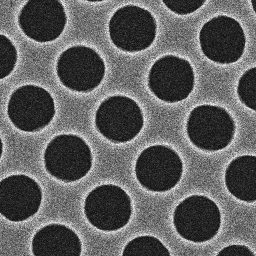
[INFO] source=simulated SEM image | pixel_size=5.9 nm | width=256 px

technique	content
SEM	a regular array of holes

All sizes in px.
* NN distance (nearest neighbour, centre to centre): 63.3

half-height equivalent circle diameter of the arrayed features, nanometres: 278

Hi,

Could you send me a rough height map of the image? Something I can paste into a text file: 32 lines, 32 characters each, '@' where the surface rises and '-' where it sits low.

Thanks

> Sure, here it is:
@@@-----@@@@@@@@@@@@@----@@@@@@-
@@@-----@@@@@@-----@@@--@@@@@@@@
@@------@@@@@@-----@@@@@@@---@@@
@@@-----@@@@@@------@@@@@-----@@
@@@----@@@@@@@-----@@@@@@------@
--@@@@@@@@@@@@-----@@@@@@------@
--@@@@@@----@@@@@@@@@@@@@-----@@
--@@@@@------@@@@@@@---@@@----@@
--@@@@@------@@@@@@-----@@@@@@@@
-@@@@@@------@@@@@@-----@@@@@@--
@@@@@@@@----@@@@@@@-----@@@@@@--
@@----@@@@@@@@@@@@@-----@@@@@@--
@------@@@@@@---@@@@---@@@@@@@--
@------@@@@@-----@@@@@@@----@@@-
@------@@@@@------@@@@@@-----@@@
@@----@@@@@@------@@@@@------@@@
@@@@@@@@@@@@-----@@@@@@------@@@
@@@@@@@---@@@@--@@@@@@@@-----@@@
@@@@@@-----@@@@@@@---@@@@---@@@@
@@@@@@-----@@@@@@-----@@@@@@@@-@
@@@@@@-----@@@@@@------@@@@@@---
@@@@@@-----@@@@@@------@@@@@----
----@@@@--@@@@@@@-----@@@@@@----
-----@@@@@@@---@@@---@@@@@@@----
-----@@@@@@-----@@@@@@@@-@@@@---
-----@@@@@@-----@@@@@@-----@@@@@
-----@@@@@@-----@@@@@@-----@@@@@
@--@@@@@@@@-----@@@@@@------@@@@
@@@@@---@@@@---@@@@@@@-----@@@@@
@@@@------@@@@@@@@-@@@@----@@@@@
@@@@------@@@@@@----@@@@@@@@@@@@
@@@@------@@@@@------@@@@@@----@